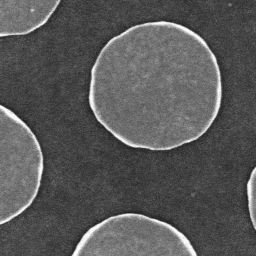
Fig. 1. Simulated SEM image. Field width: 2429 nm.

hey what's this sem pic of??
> raised bodies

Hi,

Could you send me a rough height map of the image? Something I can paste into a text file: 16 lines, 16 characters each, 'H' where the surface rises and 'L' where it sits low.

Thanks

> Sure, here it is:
HHHLLLLLLLLLLLLL
HHHLLLLLLHHLLLLL
LLLLLLLHHHHHLLLL
LLLLLLHHHHHHHLLL
LLLLLLHHHHHHHHLL
LLLLLLHHHHHHHHLL
LLLLLLHHHHHHHHLL
HLLLLLHHHHHHHLLL
HHLLLLLHHHHHLLLL
HHHLLLLLLLLLLLLL
HHHLLLLLLLLLLLLL
HHLLLLLLLLLLLLLL
HHLLLLLLLLLLLLLL
HLLLLLLHHLLLLLLL
LLLLLLHHHHHLLLLL
LLLLLHHHHHHHLLLL